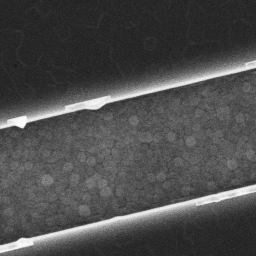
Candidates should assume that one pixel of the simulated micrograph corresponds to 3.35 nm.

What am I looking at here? one or a few lines or trenches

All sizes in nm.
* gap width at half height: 387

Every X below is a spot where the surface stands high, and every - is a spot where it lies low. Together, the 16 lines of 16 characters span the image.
XXXXXXXXXXXXXXXX
XXXXXXXXXXXXXXXX
XXXXXXXXXXXXXXXX
XXXXXXXXXXXXXXXX
XXXXXXXXXXXXXXX-
XXXXXXXXXX------
XXXXXXX---------
XX--------------
----------------
----------------
----------------
----------------
------------XXXX
--------XXXXXXXX
----XXXXXXXXXXXX
XXXXXXXXXXXXXXXX